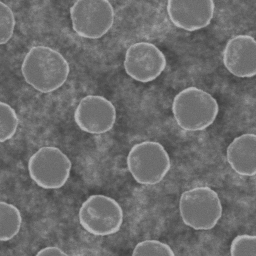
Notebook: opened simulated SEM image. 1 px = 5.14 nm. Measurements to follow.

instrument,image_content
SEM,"a regular array of raised bodies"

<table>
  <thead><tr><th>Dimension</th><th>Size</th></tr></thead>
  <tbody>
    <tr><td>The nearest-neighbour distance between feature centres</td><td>356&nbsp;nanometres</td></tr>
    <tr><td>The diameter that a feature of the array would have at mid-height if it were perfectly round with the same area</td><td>212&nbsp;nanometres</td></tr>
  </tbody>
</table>